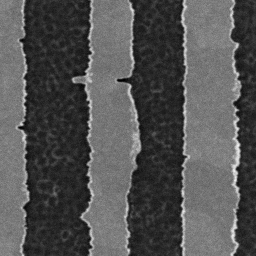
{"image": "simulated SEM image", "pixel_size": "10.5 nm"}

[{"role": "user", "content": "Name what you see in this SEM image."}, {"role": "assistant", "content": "one or a few lines or trenches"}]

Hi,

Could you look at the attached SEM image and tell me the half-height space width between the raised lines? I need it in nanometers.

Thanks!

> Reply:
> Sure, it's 603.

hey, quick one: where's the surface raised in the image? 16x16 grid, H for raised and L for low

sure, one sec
HLLLLLHHLLLHHHHL
HHLLLLHHLLLHHHHL
HLLLLLHHLLLLHHHL
HHLLLLHHLLLLHHHL
HHLLLHHHLLLLHHHL
HHLLLHHHLLLLHHHL
HHLLLLHHLLLLHHHL
HLLLLLHHHLLLHHHL
HLLLLLHHHLLLHHHL
HHLLLLHHHLLLHHHL
HHLLLLHHLLLHHHHL
HHLLLLHHLLLHHHHL
HHLLLLHHLLLHHHHL
HHLLLHHHLLLHHHHL
HHLLLLHHLLLHHHHL
HLLLLLHHLLLHHHHL